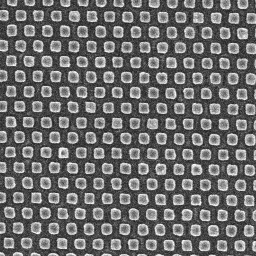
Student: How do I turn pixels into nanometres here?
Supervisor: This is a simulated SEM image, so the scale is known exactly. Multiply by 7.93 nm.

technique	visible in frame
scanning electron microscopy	a regular array of raised bodies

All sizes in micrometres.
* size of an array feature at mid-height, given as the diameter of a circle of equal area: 0.0891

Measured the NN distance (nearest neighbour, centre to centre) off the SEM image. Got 17.3 px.